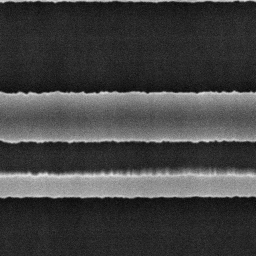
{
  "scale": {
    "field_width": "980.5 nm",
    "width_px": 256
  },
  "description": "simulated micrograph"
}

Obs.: lines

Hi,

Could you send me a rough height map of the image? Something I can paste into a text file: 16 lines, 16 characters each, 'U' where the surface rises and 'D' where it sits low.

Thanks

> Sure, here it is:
DDDDDDDDDDDDDDDD
DDDDDDDDDDDDDDDD
DDDDDDDDDDDDDDDD
DDDDDDDDDDDDDDDD
DDDDDDDDDDDDDDDD
DDDDDDDDDDDDDDDD
UUUUUUUUUUUUUUUU
UUUUUUUUUUUUUUUU
UUUUUUUUUUUUUUUU
UUUUUUUUUUUUUUUU
UUUUUUUUUUUUUUUU
UUUUUUUUUUUUUUUU
DDDDDDDDDDDDDDDD
DDDDDDDDDDDDDDDD
DDDDDDDDDDDDDDDD
DDDDDDDDDDDDDDDD